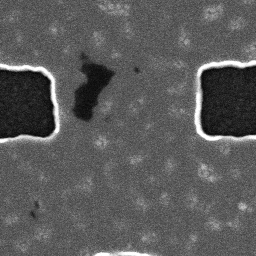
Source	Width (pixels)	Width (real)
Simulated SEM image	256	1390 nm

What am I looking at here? holes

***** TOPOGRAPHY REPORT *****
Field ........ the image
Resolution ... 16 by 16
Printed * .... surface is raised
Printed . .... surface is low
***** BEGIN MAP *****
****************
****************
****************
****************
..***********...
...**********...
...**********...
...*********....
...***********..
****************
****************
****************
****************
****************
****************
****************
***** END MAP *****